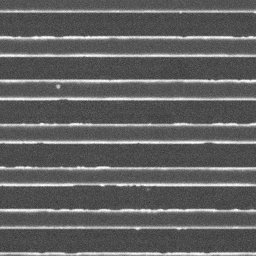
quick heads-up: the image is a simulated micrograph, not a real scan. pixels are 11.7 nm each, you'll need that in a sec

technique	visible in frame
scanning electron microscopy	lines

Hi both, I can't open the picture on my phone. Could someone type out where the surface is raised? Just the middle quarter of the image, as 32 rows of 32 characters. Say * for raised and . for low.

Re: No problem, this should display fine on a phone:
................................
................................
................................
................................
********************************
********************************
********************************
********************************
********************************
................................
................................
................................
................................
................................
................................
********************************
********************************
********************************
********************************
********************************
................................
................................
................................
................................
................................
................................
********************************
********************************
********************************
********************************
................................
................................